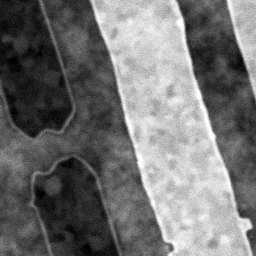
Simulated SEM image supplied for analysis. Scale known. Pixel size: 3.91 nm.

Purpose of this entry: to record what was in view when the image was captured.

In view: one or a few lines or trenches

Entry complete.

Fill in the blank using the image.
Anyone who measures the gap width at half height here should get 194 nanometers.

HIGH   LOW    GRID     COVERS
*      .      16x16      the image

***...*****...**
***...*****....*
***....*****...*
****...*****...*
****...*****....
****...*****....
*****...*****...
.***....*****...
........*****...
.........*****..
...***...*****..
..****...*****..
..****...******.
..*****...*****.
...****...*****.
...****....*****